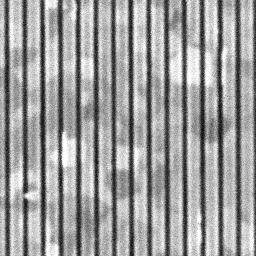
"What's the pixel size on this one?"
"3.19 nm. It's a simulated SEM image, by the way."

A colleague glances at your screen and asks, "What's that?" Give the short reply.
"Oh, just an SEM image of parallel lines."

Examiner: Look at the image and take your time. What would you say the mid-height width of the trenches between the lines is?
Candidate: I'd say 0.0211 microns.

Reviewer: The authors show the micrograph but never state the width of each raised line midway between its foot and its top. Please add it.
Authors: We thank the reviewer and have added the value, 36.3 nm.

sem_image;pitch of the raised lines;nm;56.6